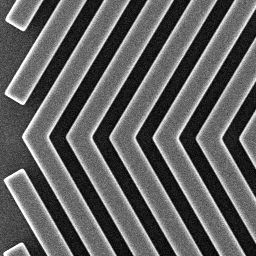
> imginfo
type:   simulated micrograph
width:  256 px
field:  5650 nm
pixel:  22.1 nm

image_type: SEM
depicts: groups of lines, slits or small figures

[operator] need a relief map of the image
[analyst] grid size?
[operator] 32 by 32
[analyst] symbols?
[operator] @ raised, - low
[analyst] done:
--@@@--@@@---@@@--@@@---@@@--@@@
-@@@---@@@--@@@---@@@--@@@---@@@
-@@@--@@@---@@@--@@@--@@@@--@@@-
--@---@@@--@@@--@@@@--@@@--@@@--
-----@@@--@@@@--@@@--@@@---@@@--
----@@@@--@@@--@@@---@@@--@@@---
----@@@--@@@---@@@--@@@--@@@@--@
---@@@---@@@--@@@--@@@@--@@@--@@
---@@@--@@@--@@@@--@@@--@@@---@@
--@@@--@@@@--@@@--@@@---@@@--@@@
-@@@---@@@--@@@---@@@--@@@---@@@
-@@@--@@@---@@@--@@@--@@@@--@@@-
--@---@@@--@@@--@@@@--@@@--@@@--
-----@@@--@@@@--@@@--@@@---@@@--
----@@@@--@@@--@@@---@@@--@@@---
----@@@--@@@---@@@--@@@---@@@--@
---@@@---@@@--@@@---@@@--@@@--@@
---@@@--@@@@--@@@--@@@---@@@--@@
----@@@--@@@--@@@@--@@@--@@@---@
----@@@---@@@--@@@--@@@---@@@--@
-----@@@--@@@---@@@--@@@--@@@---
--@--@@@---@@@--@@@--@@@@--@@@--
-@@@--@@@--@@@---@@@--@@@--@@@@-
-@@@--@@@@--@@@--@@@---@@@--@@@-
--@@@--@@@--@@@@--@@@--@@@---@@@
--@@@---@@@--@@@--@@@@--@@@--@@@
---@@@--@@@---@@@--@@@--@@@@--@@
---@@@@--@@@--@@@---@@@--@@@--@@
----@@@--@@@@--@@@--@@@---@@@--@
-----@@@--@@@--@@@---@@@--@@@--@
-----@@@---@@@--@@@--@@@---@@@--
-@@---@@@--@@@--@@@@--@@@--@@@--